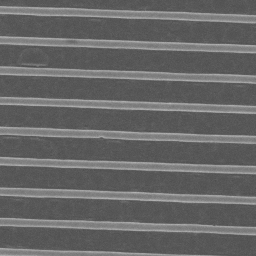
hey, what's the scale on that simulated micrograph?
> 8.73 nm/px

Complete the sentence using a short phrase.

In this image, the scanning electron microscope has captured parallel lines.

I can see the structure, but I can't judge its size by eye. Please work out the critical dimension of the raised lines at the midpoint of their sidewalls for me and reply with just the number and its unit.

67.6 nm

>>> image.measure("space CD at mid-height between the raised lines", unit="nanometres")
194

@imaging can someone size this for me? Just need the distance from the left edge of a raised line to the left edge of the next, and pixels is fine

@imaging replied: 30.2